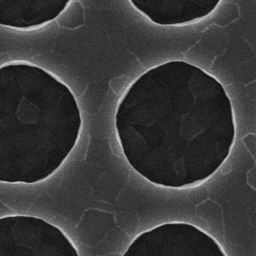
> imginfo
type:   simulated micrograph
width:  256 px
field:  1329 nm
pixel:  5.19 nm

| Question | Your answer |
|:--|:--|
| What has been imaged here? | holes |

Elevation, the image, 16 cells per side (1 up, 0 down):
0000111110000111
0001111111011111
1111111111111111
1111111111111111
0001111110000111
0000111100000011
0000011000000011
0000011000000001
0000011000000001
0000111100000011
0000111100000011
1111111111001111
1111111111111111
1011111111111111
0000111110000111
0000011100000011